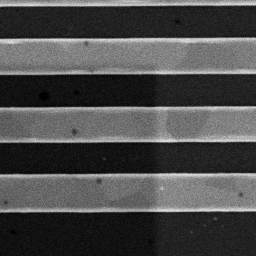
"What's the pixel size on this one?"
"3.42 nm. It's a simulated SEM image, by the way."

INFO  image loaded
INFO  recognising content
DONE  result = wiring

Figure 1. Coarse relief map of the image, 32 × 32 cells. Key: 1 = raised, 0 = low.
11111111111111111111111111111111
00000000000000000000000000000000
00000000000000000000000000000000
00000000000000000000000000000000
00000000000000000000000000000000
11111111111111111111111111111111
11111111111111111111111111111111
11111111111111111111111111111111
11111111111111111111111111111111
00000000000000000000000000000000
00000000000000000000000000000000
00000000000000000000000000000000
00000000000000000000000000000000
01111111111111111111111111111111
11111111111111111111111111111111
11111111111111111111111111111111
11111111111111111111111111111111
11111111111111111111111111111111
00000000000000000000000000000000
00000000000000000000000000000000
00000000000000000000000000000000
00000000000000000000000000000000
11111111111111111111111111111111
11111111111111111111111111111111
11111111111111111111111111111111
11111111111111111111111111111111
11110000011100000000000000000000
00000000000000000000000000000000
00000000000000000000000000000000
00000000000000000000000000000000
00000000000000000000000000000000
00000000000000000000000000000000